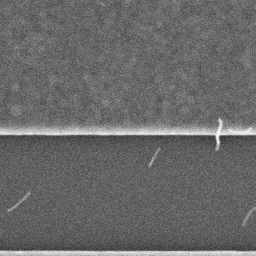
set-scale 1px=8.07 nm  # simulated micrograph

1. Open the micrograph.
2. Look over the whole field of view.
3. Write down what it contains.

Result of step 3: wiring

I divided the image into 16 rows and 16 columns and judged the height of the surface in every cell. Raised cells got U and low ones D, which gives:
UUUUUUUUUUUUUUUU
UUUUUUUUUUUUUUUU
UUUUUUUUUUUUUUUU
UUUUUUUUUUUUUUUU
UUUUUUUUUUUUUUUU
UUUUUUUUUUUUUUUU
UUUUUUUUUUUUUUUU
UUUUUUUUUUUUUUUU
DDDDDDDDDDDDDUDD
DDDDDDDDDDDDDDDD
DDDDDDDDDDDDDDDD
DDDDDDDDDDDDDDDD
DDDDDDDDDDDDDDDD
DDDDDDDDDDDDDDDD
DDDDDDDDDDDDDDDD
DDDDDDDDDDDDDDDD